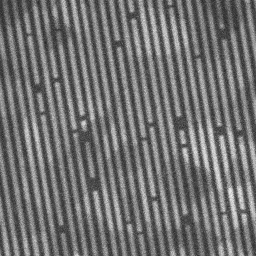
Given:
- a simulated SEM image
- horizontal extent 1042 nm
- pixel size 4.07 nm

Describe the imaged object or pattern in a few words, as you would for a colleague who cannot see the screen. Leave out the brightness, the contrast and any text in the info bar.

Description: parallel lines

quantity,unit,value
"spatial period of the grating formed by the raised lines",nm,39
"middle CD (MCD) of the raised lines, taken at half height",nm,13.5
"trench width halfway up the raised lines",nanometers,24.1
